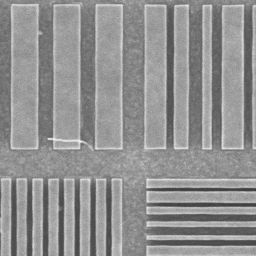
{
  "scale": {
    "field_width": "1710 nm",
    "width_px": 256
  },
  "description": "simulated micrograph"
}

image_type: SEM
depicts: groups of lines, slits or small figures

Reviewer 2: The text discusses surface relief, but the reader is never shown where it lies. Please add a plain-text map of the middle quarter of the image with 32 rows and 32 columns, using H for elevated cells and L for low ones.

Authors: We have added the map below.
HHHHLLLLHHHHHHHLLLLLHHHHHHLLHHHL
HHHHLLLLHHHHHHHLLLLLHHHHHHLLHHHL
HHHHLLLLHHHHHHHLLLLLHHHHHHLLHHHL
HHHHLLLLHHHHHHLLLLLLHHHHHHLLHHHL
HHHHLLLLHHHHHHLLLLLLHHHHHHLLHHHL
HHHHLLLLHHHHHHLLLLLLHHHHHLLLHHHL
HHHHLLLLHHHHHHLLLLLLHHHHHLLLHHHL
HHHHLLLLHHHHHHLLLLLLHHHHHLLLHHHL
HHHHLLLLHHHHHHLLLLLLHHHHHLLLHHHL
HHHHLLLLHHHHHHLLLLLLHHHHHLLLHHHL
HHHHLLLLHHHHHHLLLLLLHHHHHLLLHHHL
HHHHLLLLHHHHHHLLLLLLHHHHHLLLHHHL
HHHHLLLLHHHHHHLLLLLLHHHHHLLLHHHL
HHHHLLLLHHHHHHLLLLLLHHHHHLLLHHHL
HHHHLLLLHHHHHHHLLLLLHHHHHHLLHHHL
HHHHLLLLHHHHHHHLLLLLHHHHHHLLHHHL
HHHHLLLLHHHHHHHLLLLLHHHHHLLLHHHL
HHHHLLLLHHHHHHLLLLLLHHHHHLLLHHHL
HHHHLLLLHHHHHHLLLLLLHHHHHLLLHHHL
HHHHLLLLHHHHHHLLLLLLHHHHHLLLHHHL
HHHHLLLLHHHHHHLLLLLLHHHHHLLLHHHL
LLLLLLLLLLLLLLLLLLLLLLLLLLLLLLLL
LLLLLLLLLLLLLLLLLLLLLLLLLLLLLLLL
LLLLLLLLLLLLLLLLLLLLLLLLLLLLLLLL
LLLLLLLLLLLLLLLLLLLLLLLLLLLLLLLL
LLLLLLLLLLLLLLLLLLLLLLLLLLLLLLLL
LLLLLLLLLLLLLLLLLLLLLLLLLLLLLLLL
LLLLLLLLLLLLLLLLLLLLLLLLLLLLLLLL
LLLLLLLLLLLLLLLLLLLLLLLLLLLLLLLL
HHHLHHLLHHLLHHLLLLLLLHHHHHHHHHHH
HHHLHHLLHHLLHHLLLLLLLHHHHHHHHHHH
HHHLHHLLHHLLHHLLLLLLLLLLLLLLLLLL